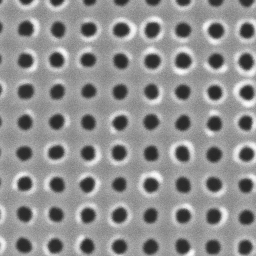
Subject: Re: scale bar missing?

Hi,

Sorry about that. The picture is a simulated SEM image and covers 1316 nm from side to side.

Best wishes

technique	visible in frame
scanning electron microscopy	a regular array of holes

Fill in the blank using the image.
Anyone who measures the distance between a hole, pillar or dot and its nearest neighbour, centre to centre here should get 157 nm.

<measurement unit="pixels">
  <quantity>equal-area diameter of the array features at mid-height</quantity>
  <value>16.1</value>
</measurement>